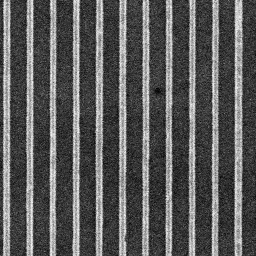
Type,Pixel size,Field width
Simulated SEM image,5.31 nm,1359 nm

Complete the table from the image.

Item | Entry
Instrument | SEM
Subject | parallel lines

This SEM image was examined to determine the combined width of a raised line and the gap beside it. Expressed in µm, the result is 0.123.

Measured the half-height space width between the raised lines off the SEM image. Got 94.9 nm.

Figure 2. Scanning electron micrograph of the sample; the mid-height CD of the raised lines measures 27.2 nm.